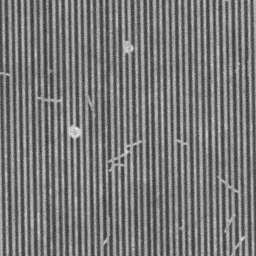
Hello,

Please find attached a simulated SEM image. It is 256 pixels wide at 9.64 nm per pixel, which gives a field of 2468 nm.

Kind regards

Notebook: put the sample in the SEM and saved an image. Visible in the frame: parallel lines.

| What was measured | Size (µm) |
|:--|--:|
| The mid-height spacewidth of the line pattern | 0.0374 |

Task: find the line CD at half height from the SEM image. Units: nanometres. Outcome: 27.7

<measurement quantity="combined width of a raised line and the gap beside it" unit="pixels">6.3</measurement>